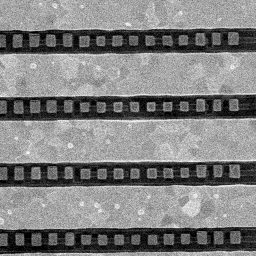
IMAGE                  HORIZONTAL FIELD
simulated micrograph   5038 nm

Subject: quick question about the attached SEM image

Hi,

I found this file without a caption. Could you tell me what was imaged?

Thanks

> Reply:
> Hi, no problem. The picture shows wiring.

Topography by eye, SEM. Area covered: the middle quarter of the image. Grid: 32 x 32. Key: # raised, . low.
################################
################################
################################
################################
################################
################################
################################
################################
................................
##..............................
##..##..##...#...#...##..##..##.
##..##..##...#...#...#...##..##.
................................
................................
################################
################################
################################
################################
################################
################################
################################
################################
################################
################################
................................
................................
##..##...#...#.......##..##..##.
##..##...#...##..##..##..##..##.
.#..##...#...#..................
................................
................................
################################